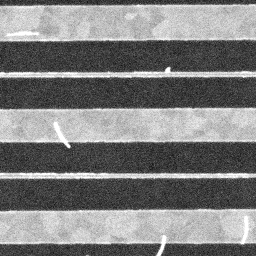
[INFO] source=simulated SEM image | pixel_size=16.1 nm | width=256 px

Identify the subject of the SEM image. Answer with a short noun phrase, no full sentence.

lines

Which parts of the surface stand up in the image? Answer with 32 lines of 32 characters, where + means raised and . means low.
................................
++++++++++++++++++++++++++++++++
++++++++++++++++++++++++++++++++
++++++++++++++++++++++++++++++++
++++++++++++++++++++++++++++++++
................................
................................
................................
................................
.........................+......
................................
................................
................................
................................
++++++++++++++++++++++++++++++++
++++++++++++++++++++++++++++++++
++++++++++++++++++++++++++++++++
++++++++++++++++++++++++++++++++
................................
................................
................................
................................
................................
................................
................................
................................
.+++++++++++++++++++++++++++++++
++++++++++++++++++++++++++++++++
++++++++++++++++++++++++++++++++
++++++++++++++++++++++++++++++++
....................+...........
................................